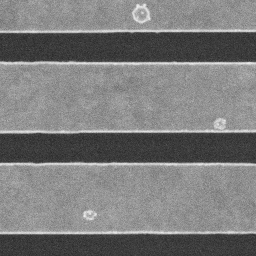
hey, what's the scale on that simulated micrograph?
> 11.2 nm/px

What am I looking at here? lines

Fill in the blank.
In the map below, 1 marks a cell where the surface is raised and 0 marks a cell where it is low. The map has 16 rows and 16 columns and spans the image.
1111111111111111
1111111111111111
0000000000000000
0000000000000000
1111111111111111
1111111111111111
1111111111111111
1111111111111111
0000000000000000
0000000000000000
1111111111111111
1111111111111111
1111111111111111
1111111111111111
1111111111111111
0000000000000000